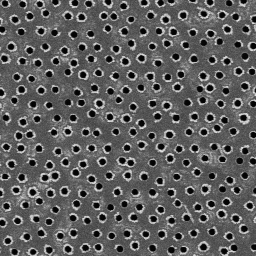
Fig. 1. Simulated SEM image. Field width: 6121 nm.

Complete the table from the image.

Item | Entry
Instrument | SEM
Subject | a regular array of holes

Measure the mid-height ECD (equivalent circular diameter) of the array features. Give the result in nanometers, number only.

157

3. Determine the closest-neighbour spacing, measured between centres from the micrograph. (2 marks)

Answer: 13.6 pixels